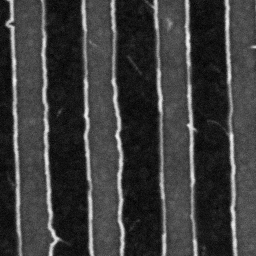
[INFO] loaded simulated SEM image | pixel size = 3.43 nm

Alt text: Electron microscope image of one or a few lines or trenches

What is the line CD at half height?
149 nm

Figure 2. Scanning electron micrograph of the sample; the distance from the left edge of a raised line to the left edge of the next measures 247 nm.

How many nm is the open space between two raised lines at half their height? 95.2